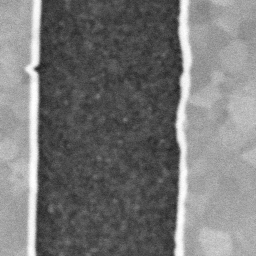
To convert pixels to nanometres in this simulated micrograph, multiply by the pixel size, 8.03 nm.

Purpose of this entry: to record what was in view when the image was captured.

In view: one or a few lines or trenches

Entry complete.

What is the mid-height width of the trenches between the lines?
1200 nm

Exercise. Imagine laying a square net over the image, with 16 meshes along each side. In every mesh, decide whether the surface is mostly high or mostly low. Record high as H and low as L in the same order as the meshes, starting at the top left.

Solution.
HHLLLLLLLLLLHHHH
HHLLLLLLLLLHHHHH
HHLLLLLLLLLLHHHH
HHLLLLLLLLLLHHHH
HHLLLLLLLLLLHHHH
HHLLLLLLLLLLHHHH
HHLLLLLLLLLHHHHH
HHLLLLLLLLLHHHHH
HHLLLLLLLLLHHHHH
HHLLLLLLLLLHHHHH
HHLLLLLLLLLHHHHH
HHLLLLLLLLLHHHHH
HHLLLLLLLLLHHHHH
HHLLLLLLLLLHHHHH
HHLLLLLLLLLHHHHH
HHLLLLLLLLLHHHHH